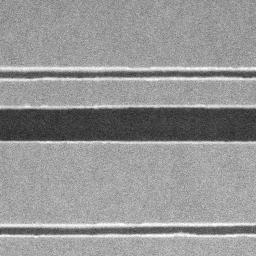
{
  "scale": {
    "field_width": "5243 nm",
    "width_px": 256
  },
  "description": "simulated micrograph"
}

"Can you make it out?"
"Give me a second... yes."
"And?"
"lines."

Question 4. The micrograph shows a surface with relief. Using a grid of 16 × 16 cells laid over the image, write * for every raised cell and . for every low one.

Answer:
****************
****************
****************
****************
****************
****************
****************
................
................
****************
****************
****************
****************
****************
****************
****************